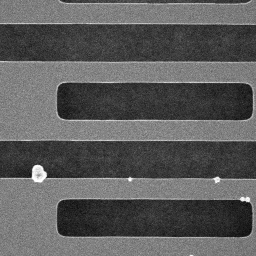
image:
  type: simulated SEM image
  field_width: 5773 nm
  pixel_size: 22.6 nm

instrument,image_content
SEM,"groups of lines, slits or small figures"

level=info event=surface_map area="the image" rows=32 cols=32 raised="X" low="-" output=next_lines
XXXXXXXXXXXXXXXXXXXXXXXXXXXX-XXX
XXXXXXXXXXXXXXXXXXXXXXXXXXXXXXXX
XXXXXXXXXXXXXXXXXXXXXXXXXXXXXXXX
--------------------------------
--------------------------------
--------------------------------
--------------------------------
--------------------------------
XXXXXXXXXXXXXXXXXXXXXXXXXXXXXXXX
XXXXXXXXXXXXXXXXXXXXXXXXXXXXXXXX
XXXXXXXX-----------------------X
XXXXXXX-------------------------
XXXXXXX-------------------------
XXXXXXX-------------------------
XXXXXXX------------------------X
XXXXXXXXXXXXXXXXXXXXXXXXXXXXXXXX
XXXXXXXXXXXXXXXXXXXXXXXXXXXXXXXX
XXXXXX-XXXXXXXXXXXXXXXXXXXXXXXXX
--------------------------------
--------------------------------
--------------------------------
----XX--------------------------
XXXXXXXXXXXXXXXXXXXXXXXXXXXXXXXX
XXXXXXXXXXXXXXXXXXXXXXXXXXXXXXXX
XXXXXXXXXXXXXXXXXXXXXXXXXXXXXXXX
XXXXXXX------------------------X
XXXXXXX-------------------------
XXXXXXX-------------------------
XXXXXXX-------------------------
XXXXXXXX-----------------------X
XXXXXXXXXXXXXXXXXXXXXXXXXXXXXXXX
XXXXXXXXXXXXXXXXXXXXXXXXXXXXXXXX